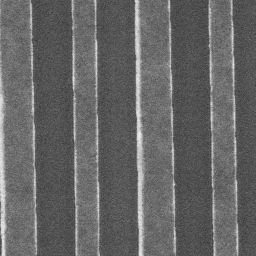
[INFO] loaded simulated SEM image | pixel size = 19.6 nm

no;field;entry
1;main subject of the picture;lines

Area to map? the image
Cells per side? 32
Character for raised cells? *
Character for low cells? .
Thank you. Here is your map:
****.....***.....****.....***...
****.....***.....****.....***...
****.....***.....****.....***...
****.....***.....****.....***...
****.....***.....****.....***...
****.....***.....****.....***...
****.....***.....****.....***...
****.....***.....****.....***...
****.....***.....****.....***...
****.....***.....****.....***...
****.....***.....****.....***...
****.....***.....****.....***...
****.....***.....****.....***...
****.....***.....*****....***...
****.....***.....*****....***...
****.....***.....*****....***...
****.....***.....*****.....**...
****.....***.....*****.....**...
****.....***.....*****.....**...
****.....***.....*****.....**...
****.....***.....*****.....**...
****.....***.....*****.....**...
****.....***.....*****.....***..
****.....***.....*****.....***..
****.....***.....*****.....***..
****.....***.....*****.....***..
****......**.....*****.....***..
****......**.....*****.....***..
****......**.....*****.....***..
****......**......****.....***..
****......**.....*****.....***..
****......**......****.....***..